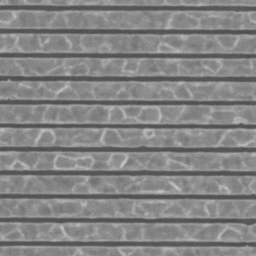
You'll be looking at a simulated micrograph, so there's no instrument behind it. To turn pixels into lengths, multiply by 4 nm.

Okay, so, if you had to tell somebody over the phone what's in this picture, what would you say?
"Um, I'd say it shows parallel lines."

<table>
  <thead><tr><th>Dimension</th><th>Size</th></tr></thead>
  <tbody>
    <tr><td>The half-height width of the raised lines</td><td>73.6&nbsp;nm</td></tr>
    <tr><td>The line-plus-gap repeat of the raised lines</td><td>0.0943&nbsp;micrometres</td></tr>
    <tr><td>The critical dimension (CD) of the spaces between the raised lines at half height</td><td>5.12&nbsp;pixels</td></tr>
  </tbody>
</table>